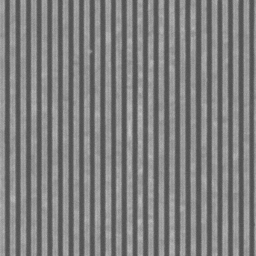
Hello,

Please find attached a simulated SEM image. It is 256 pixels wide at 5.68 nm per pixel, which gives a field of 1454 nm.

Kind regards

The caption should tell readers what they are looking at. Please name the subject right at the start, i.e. parallel lines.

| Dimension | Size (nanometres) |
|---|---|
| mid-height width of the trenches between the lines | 32.7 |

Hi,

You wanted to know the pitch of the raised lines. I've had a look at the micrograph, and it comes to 60.3 nanometers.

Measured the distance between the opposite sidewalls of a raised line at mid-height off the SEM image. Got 27 nm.